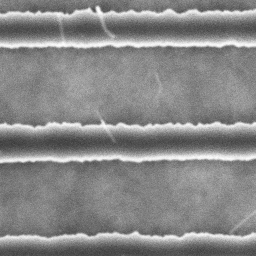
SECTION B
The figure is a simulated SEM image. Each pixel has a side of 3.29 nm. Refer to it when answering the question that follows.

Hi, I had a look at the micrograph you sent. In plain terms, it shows lines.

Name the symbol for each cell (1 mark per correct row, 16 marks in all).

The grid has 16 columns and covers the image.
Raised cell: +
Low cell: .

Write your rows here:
................
++++++++++++++++
++++++++++++++++
................
................
................
................
................
++++++++++++++++
++++++++++++++++
................
................
................
................
................
++++++++++++++++